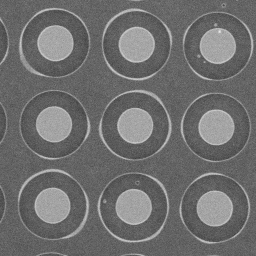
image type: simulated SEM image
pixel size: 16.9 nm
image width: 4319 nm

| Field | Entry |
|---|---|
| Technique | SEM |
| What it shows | an array of small figures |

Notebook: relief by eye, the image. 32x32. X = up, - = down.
XXXXXXXXXXXXXXXXXXXXXXXXXXXXXXXX
XXXXX----XXXXXXX--XXXXXXXXXXXXXX
XXXX------XXXX------XXXXX-----XX
-XX--------XX--------XXX-------X
-XX--------XX--------XX--------X
-XX--------XX--------XX---------
-XX--------XX--------XX--------X
XXX--------XX--------XX--------X
XXXX------XXXX------XXXX------XX
XXXXXX--XXXXXXX----XXXXXX----XXX
XXXXXXXXXXXXXXXXXXXXXXXXXXXXXXXX
XXXXXX--XXXXXXXX--XXXXXXXXXXXXXX
XXXX------XXXX------XXXXX-----XX
XXX-------XXX--------XXX------XX
-XX--------XX--------XX--------X
-XX--------XX--------XX--------X
-XX--------XX--------XX--------X
XXX--------XX--------XX--------X
XXXX------XXXX------XXXX------XX
XXXXX---XXXXXXX----XXXXXX----XXX
XXXXXXXXXXXXXXXXXXXXXXXXXXXXXXXX
XXXXX---XXXXXXXXXXXXXXXXXXXXXXXX
XXXX-----XXXXX-----XXXXXX----XXX
XXX-------XXX-------XXXX------XX
XX---------XX--------XX--------X
-X---------X---------XX--------X
-X---------X---------XX--------X
XXX--------XX--------XX--------X
XXX-------XXX-------XXX-------XX
XXXXX----XXXXX-----XXXXX-----XXX
XXXXXXXXXXXXXXXXXXXXXXXXXXXXXXXX
XXXXXXXXXXXXXXXXXXXXXXXXXXXXXXXX